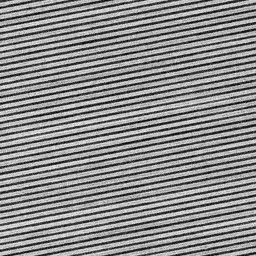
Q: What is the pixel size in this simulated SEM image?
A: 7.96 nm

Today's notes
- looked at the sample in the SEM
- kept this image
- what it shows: parallel lines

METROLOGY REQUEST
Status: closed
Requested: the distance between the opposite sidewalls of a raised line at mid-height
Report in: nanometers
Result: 22.5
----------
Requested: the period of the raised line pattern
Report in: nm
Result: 49.9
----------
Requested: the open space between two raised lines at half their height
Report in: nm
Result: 22.5